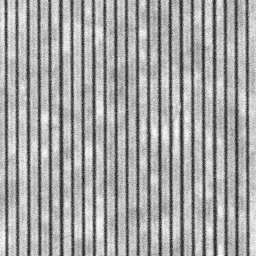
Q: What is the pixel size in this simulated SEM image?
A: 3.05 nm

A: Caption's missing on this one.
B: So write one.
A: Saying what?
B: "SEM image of parallel lines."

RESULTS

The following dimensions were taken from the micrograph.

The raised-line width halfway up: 21.7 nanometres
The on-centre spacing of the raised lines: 0.0334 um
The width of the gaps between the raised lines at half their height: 11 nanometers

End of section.